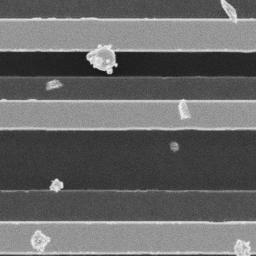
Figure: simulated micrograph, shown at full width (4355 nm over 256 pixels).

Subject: lines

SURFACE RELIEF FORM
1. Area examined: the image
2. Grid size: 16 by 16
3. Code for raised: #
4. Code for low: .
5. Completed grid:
################
################
################
.....##.........
......#.........
################
################
################
................
................
................
...#............
################
################
################
################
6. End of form